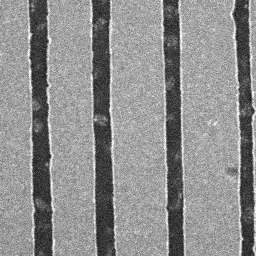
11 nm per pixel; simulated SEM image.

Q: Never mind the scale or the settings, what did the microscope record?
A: one or a few lines or trenches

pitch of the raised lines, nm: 760